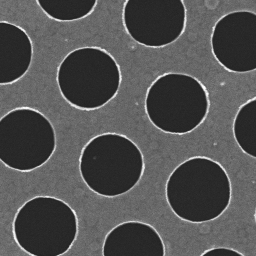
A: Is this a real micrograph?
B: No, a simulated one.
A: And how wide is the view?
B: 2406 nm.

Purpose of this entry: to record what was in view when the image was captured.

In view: holes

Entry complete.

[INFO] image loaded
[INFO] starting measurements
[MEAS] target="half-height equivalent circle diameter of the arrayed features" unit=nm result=571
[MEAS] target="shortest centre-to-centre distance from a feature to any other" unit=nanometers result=843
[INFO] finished